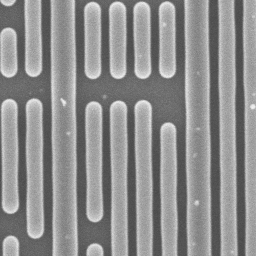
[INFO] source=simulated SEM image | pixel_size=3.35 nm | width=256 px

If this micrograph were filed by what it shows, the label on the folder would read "groups of lines, slits or small figures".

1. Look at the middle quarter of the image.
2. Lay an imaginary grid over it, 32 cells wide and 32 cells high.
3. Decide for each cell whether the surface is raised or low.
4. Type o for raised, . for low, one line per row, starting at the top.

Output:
ooo..oooo...ooo...oooo..oooo...o
ooo..oooo...ooo...oooo..oooo...o
ooo...ooo...ooo...ooo...oooo...o
ooo............................o
ooo............................o
ooo............................o
ooo............................o
ooo............................o
ooo............................o
ooo..........o.....oo..........o
ooo...ooo...ooo...oooo.........o
ooo...ooo...oooo..oooo.........o
ooo...ooo...oooo..oooo.........o
ooo...ooo...oooo..oooo.........o
ooo...ooo...oooo..oooo.........o
ooo...ooo...oooo..oooo...ooo...o
ooo...ooo...oooo..oooo..oooo...o
ooo...ooo...oooo..oooo..oooo...o
ooo...ooo...oooo..oooo..oooo...o
ooo...ooo...oooo..oooo..oooo...o
ooo...ooo...oooo..oooo..oooo...o
ooo...ooo...oooo..oooo..oooo...o
ooo...ooo...oooo..oooo..oooo...o
ooo...ooo...oooo..oooo..oooo...o
ooo...ooo...oooo..oooo..oooo...o
ooo...ooo...oooo..oooo..oooo...o
ooo...ooo...oooo..oooo..oooo...o
ooo...ooo...oooo..oooo..oooo...o
ooo...ooo...oooo..oooo..oooo...o
ooo...ooo...oooo..oooo..oooo...o
ooo...ooo...oooo..oooo..oooo...o
ooo...ooo...oooo..oooo..oooo...o